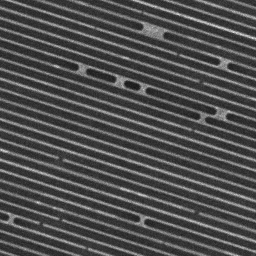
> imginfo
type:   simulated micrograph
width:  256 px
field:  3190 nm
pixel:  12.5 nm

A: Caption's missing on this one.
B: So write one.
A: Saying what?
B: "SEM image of parallel lines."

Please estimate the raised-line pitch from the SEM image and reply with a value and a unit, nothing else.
120 nanometers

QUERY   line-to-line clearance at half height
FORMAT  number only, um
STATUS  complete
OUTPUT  0.101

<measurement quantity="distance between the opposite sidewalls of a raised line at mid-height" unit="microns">0.0223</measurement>